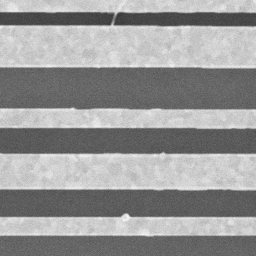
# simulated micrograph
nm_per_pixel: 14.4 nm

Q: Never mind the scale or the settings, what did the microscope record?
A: lines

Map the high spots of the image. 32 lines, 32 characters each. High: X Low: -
XXXXXXXXXXXXXXXXXXXXXXXXXXXXXXXX
--------------X-XXXX--XX----X--X
--------------------------------
XXXXXXXXXXXXXXXXXXXXXXXXXXXXXXXX
XXXXXXXXXXXXXXXXXXXXXXXXXXXXXXXX
XXXXXXXXXXXXXXXXXXXXXXXXXXXXXXXX
XXXXXXXXXXXXXXXXXXXXXXXXXXXXXXXX
XXXXXXXXXXXXXXXXXXXXXXXXXXXXXXXX
--------------------------------
--------------------------------
--------------------------------
--------------------------------
--------------------------------
--------------------------------
XXXXXXXXXXXXXXXXXXXXXXXXXXXXXXXX
XXXXXXXXXXXXXXXXXXXXXXXXXXXXXXXX
--------------------------------
--------------------------------
--------------------------------
XXXXXXXXXXXXXXXXXXXXXXXXXXXXXXXX
XXXXXXXXXXXXXXXXXXXXXXXXXXXXXXXX
XXXXXXXXXXXXXXXXXXXXXXXXXXXXXXXX
XXXXXXXXXXXXXXXXXXXXXXXXXXXXXXXX
XXXXXXXXXXXXXXXXXXXXXXXXXXXXXXXX
--------------------------------
--------------------------------
--------------------------------
XXXXXXXXXXXXXXXXXXXXXXXXXXXXXXXX
XXXXXXXXXXXXXXXXXXXXXXXXXXXXXXXX
--------------------------------
--------------------------------
--------------------------------